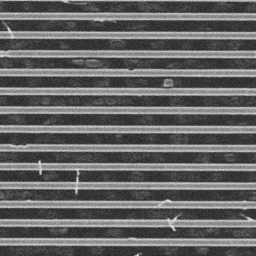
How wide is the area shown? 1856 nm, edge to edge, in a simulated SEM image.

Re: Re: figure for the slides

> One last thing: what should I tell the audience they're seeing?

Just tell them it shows parallel lines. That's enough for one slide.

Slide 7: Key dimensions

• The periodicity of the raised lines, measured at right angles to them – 0.136 um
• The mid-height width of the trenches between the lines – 91.5 nm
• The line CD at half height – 45.3 nanometres